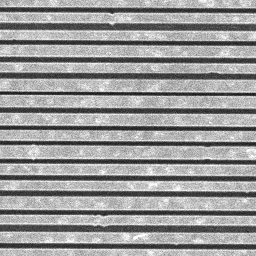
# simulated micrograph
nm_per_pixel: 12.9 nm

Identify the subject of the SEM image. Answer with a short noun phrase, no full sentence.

parallel lines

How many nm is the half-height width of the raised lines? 144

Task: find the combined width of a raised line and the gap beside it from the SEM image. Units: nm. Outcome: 219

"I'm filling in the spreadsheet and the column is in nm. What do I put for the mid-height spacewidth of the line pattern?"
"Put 66.3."